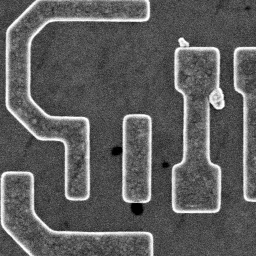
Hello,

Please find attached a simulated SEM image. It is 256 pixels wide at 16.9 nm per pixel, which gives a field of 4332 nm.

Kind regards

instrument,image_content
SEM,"wiring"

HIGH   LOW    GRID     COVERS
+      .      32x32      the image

....+++++++++++++++.............
...++++++++++++++++.............
..++++++...+++++++..............
.++++...........................
.+++............................
.+++............................
.+++..................+++++..+++
.+++..................+++++..+++
.+++..................+++++..+++
.+++..................+++++..+++
.+++..................+++++..+++
.+++...................+++++..++
.+++...................+++++...+
.++++..................+++.....+
..++++..........++.....+++.....+
...++++++++.....+++....+++.....+
....+++++++.....+++....+++.....+
.......++++.....+++....+++.....+
........+++.....+++....+++.....+
........+++.....+++....+++.....+
........+++.....+++...+++++....+
........+++.....+++...+++++....+
++++....+++.....+++...+++++....+
++++....+++....++++...+++++....+
++++....+++.....+++...+++++....+
++++..................+++++.....
++++..................+++++.....
+++++...........................
.+++++..........................
.++++++++++++++++++.............
..+++++++++++++++++.............
...++++++++++++++++.............